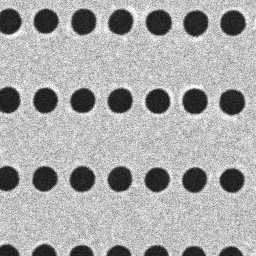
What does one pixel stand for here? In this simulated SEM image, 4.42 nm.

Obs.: a regular array of holes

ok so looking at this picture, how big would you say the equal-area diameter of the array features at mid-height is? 113 nm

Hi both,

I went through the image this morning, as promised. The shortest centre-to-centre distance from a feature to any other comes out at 165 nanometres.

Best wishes